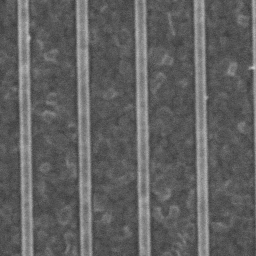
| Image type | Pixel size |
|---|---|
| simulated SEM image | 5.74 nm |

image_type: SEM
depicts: parallel lines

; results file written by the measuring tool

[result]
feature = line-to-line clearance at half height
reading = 279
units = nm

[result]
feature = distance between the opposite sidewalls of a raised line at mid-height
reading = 54.5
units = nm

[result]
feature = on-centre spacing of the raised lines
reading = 336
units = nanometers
